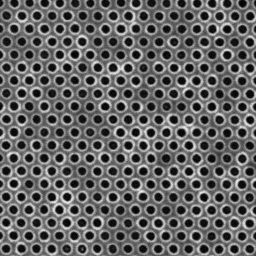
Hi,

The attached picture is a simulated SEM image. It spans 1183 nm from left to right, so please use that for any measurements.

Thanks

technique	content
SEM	a regular array of holes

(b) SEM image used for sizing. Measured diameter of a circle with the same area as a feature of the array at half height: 42.3 nanometres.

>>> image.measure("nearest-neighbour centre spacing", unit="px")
14.6